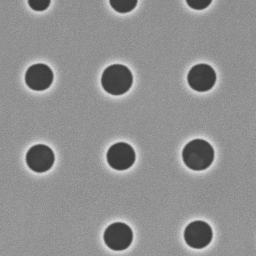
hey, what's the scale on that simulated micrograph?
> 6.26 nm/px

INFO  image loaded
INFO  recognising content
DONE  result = a regular array of holes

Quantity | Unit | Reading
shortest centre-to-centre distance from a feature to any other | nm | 486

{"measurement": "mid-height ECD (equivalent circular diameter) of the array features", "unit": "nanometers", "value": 180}